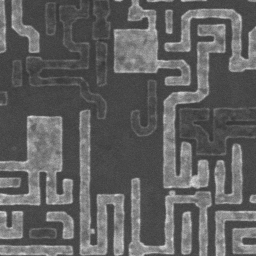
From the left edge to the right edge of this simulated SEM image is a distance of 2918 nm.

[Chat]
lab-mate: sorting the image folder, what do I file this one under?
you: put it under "wiring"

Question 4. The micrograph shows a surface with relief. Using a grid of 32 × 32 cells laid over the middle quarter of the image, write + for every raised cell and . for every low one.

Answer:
++++++..+++..++++++++++++++++++.
........+++..++++++++++......++.
........+++...................+.
+++++...++...............++++++.
++++++..++...........++..++++++.
....++...............++.........
....++...............++.........
....+++..............++....+++++
.....++++............++...++++++
.......+++...........++..+++++++
........++...........++..+++....
........++...........++..+++.+++
....++..++.......++..++..+++.+++
....++..++.......++..++..+++.+++
....++...........++..++..++..+++
....++...........++..++..++..+++
....++...........++++++..+++.+++
....++............++++...+++.+++
....++...................+++...+
....++...................+++....
....++...................+++.+++
....++...................+++.+++
....++...................+++.+++
....++...................+++.+++
....++...................+++.+++
....++...................+++.+++
....++...................+++.+++
....++...................+++.+++
....++...................+++++++
++..++...........++......+++++++
++..++...........++......+++++++
++..++...........++.............